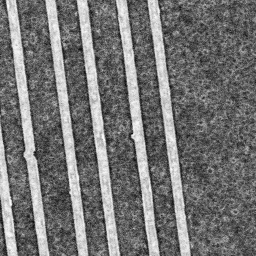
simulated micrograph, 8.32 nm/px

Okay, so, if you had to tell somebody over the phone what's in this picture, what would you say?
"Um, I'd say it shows parallel lines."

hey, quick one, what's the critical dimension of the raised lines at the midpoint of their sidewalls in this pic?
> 0.0752 µm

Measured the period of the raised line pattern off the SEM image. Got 290 nanometres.